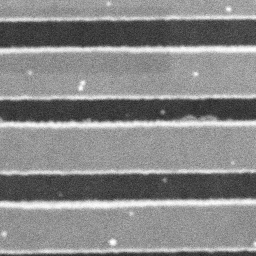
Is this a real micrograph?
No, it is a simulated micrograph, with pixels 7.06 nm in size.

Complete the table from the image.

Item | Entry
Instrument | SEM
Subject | lines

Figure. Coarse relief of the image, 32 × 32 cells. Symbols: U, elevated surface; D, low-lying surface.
UUUUUUUUUUUUUUUUUUUUUUUUUUUUUUUU
UUUUUUUUUUUUUUUUUUUUUUUUUUUUUUUU
UUUUUUDUUUUUDDUDDDDDDDDDDDDDDDDD
DDDDDDDDDDDDDDDDDDDDDDDDDDDDDDDD
DDDDDDDDDDDDDDDDDDDDDDDDDDDDDDDD
DDDDDDDDDDDDDDDDDDDDDDDDDDDDDDDD
UUUUUUUUUUUUUUUUUUUUUUUUUUUUUUUU
UUUUUUUUUUUUUUUUUUUUUUUUUUUUUUUU
UUUUUUUUUUUUUUUUUUUUUUUUUUUUUUUU
UUUUUUUUUUUUUUUUUUUUUUUUUUUUUUUU
UUUUUUUUUUUUUUUUUUUUUUUUUUUUUUUU
UUUUUUUUUUUUUUUUUUUUUUUUUUUUUUUU
DDDDDDDDDDDDDDDDDDDDDDDDDDDDDDDD
DDDDDDDDDDDDDDDDDDDDDDDDDDDDDDDD
DDDDDDDDDDDDDDDDDDDDDDDDDDDDDDDD
UUUUUUUUUUUUUUUUUUUUUUUUUUUUUUUU
UUUUUUUUUUUUUUUUUUUUUUUUUUUUUUUU
UUUUUUUUUUUUUUUUUUUUUUUUUUUUUUUU
UUUUUUUUUUUUUUUUUUUUUUUUUUUUUUUU
UUUUUUUUUUUUUUUUUUUUUUUUUUUUUUUU
UUUUUUUUUUUUUUUUUUUUUUUUUUUUUUUU
UUUUUUUUUUUUUUUUUUUUUUUUUUUUUUUU
DDDDDDDDDDDDDDDDDDDDDDDDDDDDDDDD
DDDDDDDDDDDDDDDDDDDDDDDDDDDDDDDD
DDDDDDDDDDDDDDDDDDDDDDDDDDDDDDDD
UUUUUUUUUUUUUUUUUUUUUUUUUUUUUUUU
UUUUUUUUUUUUUUUUUUUUUUUUUUUUUUUU
UUUUUUUUUUUUUUUUUUUUUUUUUUUUUUUU
UUUUUUUUUUUUUUUUUUUUUUUUUUUUUUUU
UUUUUUUUUUUUUUUUUUUUUUUUUUUUUUUU
UUUUUUUUUUUUUUUUUUUUUUUUUUUUUUUU
UUUUUUUUUUUUUUUDDDDDDDDDDDDDDDDD